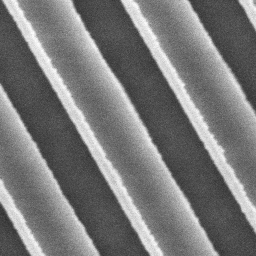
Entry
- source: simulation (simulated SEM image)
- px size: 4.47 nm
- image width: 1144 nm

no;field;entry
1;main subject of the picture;lines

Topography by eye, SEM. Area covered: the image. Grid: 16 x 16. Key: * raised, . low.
*****...****...*
.****...*****...
..****...****...
..****....****..
...****...****..
...*****...****.
*...****...****.
*....****...****
**...****...****
**....****...***
***...****....**
****...****...**
****...*****...*
.****...****...*
.****....****...
..****...****...